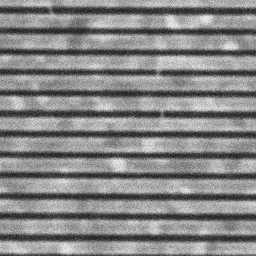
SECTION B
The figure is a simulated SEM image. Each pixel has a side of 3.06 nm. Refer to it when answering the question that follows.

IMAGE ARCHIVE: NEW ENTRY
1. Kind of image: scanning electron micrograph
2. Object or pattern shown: parallel lines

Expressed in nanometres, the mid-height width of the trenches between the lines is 22.2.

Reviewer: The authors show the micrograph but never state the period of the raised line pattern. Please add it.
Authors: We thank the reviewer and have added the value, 63.1 nanometers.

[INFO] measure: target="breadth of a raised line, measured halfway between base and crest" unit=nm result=41